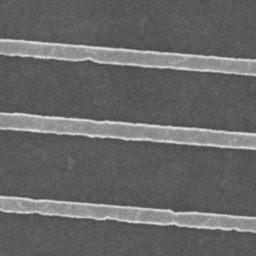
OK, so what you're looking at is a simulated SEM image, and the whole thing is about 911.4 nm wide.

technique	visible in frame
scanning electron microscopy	one or a few lines or trenches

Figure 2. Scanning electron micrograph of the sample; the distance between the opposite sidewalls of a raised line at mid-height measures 51 nanometres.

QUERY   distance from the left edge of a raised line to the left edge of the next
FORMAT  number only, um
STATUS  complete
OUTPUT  0.278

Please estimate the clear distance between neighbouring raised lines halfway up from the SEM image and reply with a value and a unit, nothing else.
228 nm